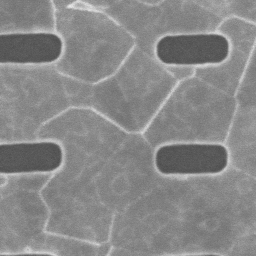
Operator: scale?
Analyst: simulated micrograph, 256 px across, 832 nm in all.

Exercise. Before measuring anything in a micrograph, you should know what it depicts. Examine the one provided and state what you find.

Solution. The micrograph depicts holes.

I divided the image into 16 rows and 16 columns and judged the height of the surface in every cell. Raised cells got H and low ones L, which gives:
HHHHHHHHHHHHHHHH
HHHHHHHHHHHHHHHH
LLLLHHHHHHLLLLHH
LLLLHHHHHHLLLLHH
HHHHHHHHHHHHHHHH
HHHHHHHHHHHHHHHH
HHHHHHHHHHHHHHHH
HHHHHHHHHHHHHHHH
HHHHHHHHHHHHHHHH
LLLLHHHHHHLLLLHH
LLLHHHHHHHLLLLHH
HHHHHHHHHHHHHHHH
HHHHHHHHHHHHHHHH
HHHHHHHHHHHHHHHH
HHHHHHHHHHHHHHHH
HHHHHHHHHHHHHHHH